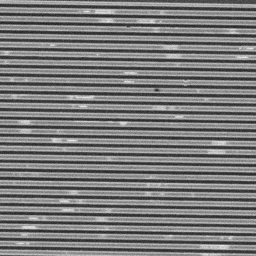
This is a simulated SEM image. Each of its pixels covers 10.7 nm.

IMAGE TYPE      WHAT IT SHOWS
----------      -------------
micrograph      parallel lines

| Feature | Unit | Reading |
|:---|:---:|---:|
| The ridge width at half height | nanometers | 46.6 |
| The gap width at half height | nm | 38.6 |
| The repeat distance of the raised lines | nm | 92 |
